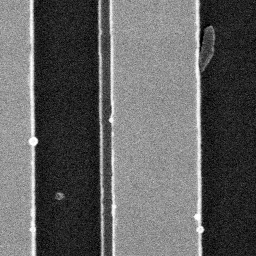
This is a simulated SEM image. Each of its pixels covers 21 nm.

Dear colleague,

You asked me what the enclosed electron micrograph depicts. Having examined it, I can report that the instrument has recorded lines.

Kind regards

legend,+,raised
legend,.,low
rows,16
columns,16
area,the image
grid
++.....+++++....
++.....+++++....
++.....+++++....
++.....+++++....
++.....+++++....
++.....+++++....
++.....+++++....
++.....+++++....
++.....+++++....
++.....+++++....
++.....+++++....
++.....+++++....
++.....+++++....
++.....+++++....
++.....++++++...
++.....+++++....